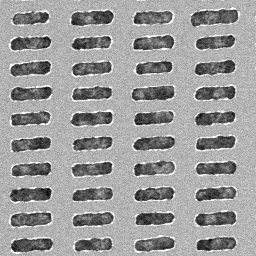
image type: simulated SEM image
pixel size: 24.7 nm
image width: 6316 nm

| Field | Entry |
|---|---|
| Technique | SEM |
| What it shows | a regular array of holes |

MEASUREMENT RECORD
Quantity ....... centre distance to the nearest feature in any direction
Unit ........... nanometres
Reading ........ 616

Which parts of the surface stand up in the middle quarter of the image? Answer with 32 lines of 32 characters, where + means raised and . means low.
++..........++++++.........+++++
++..........++++++.........+++++
++......+.++++++++...+..++++++++
++++++++++++++++++++++++++++++++
++++++++++++++++++++++++++++++++
+++++++++++++++++++++......+++++
++..........+++++...........++++
++..........+++++...........++++
++..........+++++..........+++++
++++++++++++++++++++++++++++++++
++++++++++++++++++++++++++++++++
++++++++++++++++++++++++++++++++
++..........++++++.........+++++
++..........++++++.........+++++
++..........++++++.........+++++
+++.....++++++++++++++++++++++++
++++++++++++++++++++++++++++++++
++++++++++++++++++++++++++++++++
+++++.......+++++++........+++++
++..........++++++..........++++
++..........+++++..........+++++
+++..++.++++++++++...+++.+++++++
++++++++++++++++++++++++++++++++
++++++++++++++++++++++++++++++++
++++++++++..+++++++++......+++++
++..........++++++..........++++
++..........+++++...........++++
++.........+++++++.........+++++
++++++++++++++++++++++++++++++++
++++++++++++++++++++++++++++++++
++++++++++++++++++++++++++++++++
+++.........+++++++.........++++